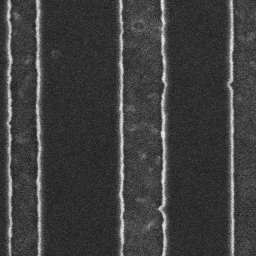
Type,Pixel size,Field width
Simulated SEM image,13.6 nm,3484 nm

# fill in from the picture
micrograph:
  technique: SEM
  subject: one or a few lines or trenches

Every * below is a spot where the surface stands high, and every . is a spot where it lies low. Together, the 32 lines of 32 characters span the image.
*....**********.....*********...
*....**********.....*********...
*....**********.....*********...
*....**********.....*********...
*....**********.....*********...
*....**********.....*********...
*....**********.....*********...
*....**********.....*********...
*....**********......********...
*....**********.....*********...
*....**********......********...
*....**********.....*********...
*....**********.....*********...
*....**********.....*********...
*....**********.....*********...
*....**********.....*********...
*....**********.....*********...
*....**********.....*********...
*....**********......********...
*....**********......********...
*....**********......********...
*....**********.....*********...
*....**********.....*********...
*....**********.....*********...
*....**********.....*********...
*....**********.....*********...
*....**********.....*********...
*....**********......********...
*....**********.....*********...
*....**********......********...
*....**********......********...
*....**********.....*********...